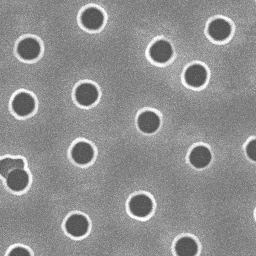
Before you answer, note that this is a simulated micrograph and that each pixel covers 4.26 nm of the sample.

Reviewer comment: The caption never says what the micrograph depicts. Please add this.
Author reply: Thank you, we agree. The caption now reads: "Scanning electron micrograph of a regular array of holes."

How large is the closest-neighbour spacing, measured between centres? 58.9 pixels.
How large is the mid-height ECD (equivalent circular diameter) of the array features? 99.3 nanometres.